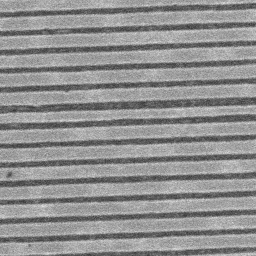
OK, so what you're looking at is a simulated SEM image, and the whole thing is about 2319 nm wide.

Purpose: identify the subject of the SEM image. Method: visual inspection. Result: parallel lines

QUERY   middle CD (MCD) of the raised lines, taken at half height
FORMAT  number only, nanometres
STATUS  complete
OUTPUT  109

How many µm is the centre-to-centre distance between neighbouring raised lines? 0.17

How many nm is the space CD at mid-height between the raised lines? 57.7